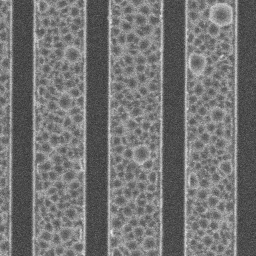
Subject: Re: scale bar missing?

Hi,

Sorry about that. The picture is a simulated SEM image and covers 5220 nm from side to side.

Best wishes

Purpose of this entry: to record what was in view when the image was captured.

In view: one or a few lines or trenches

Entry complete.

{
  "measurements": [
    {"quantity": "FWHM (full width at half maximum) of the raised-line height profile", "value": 1040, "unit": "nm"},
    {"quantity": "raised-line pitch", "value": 1550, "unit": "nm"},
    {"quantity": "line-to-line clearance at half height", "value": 24.6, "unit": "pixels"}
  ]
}